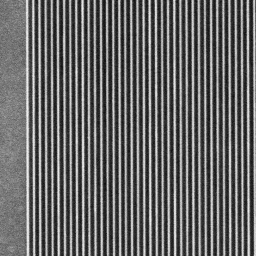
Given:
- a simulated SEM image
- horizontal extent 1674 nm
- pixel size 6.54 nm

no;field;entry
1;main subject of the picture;parallel lines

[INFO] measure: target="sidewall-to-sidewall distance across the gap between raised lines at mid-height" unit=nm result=30.3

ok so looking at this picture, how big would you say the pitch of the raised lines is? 0.0401 microns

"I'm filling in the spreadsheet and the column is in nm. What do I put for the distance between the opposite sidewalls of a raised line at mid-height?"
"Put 12.3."